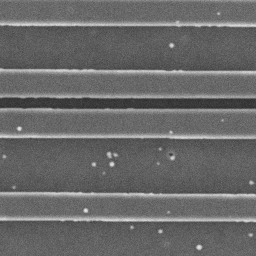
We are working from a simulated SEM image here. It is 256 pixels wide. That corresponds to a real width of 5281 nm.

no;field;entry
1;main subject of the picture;lines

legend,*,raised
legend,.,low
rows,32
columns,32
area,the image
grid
********************************
********************************
********************************
................................
................................
................................
................................
................................
................................
********************************
********************************
********************************
................................
................................
********************************
********************************
********************************
................................
................................
................................
................................
................................
................................
................................
********************************
********************************
********************************
.......*.***********************
................................
................................
................................
................................